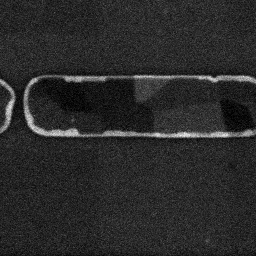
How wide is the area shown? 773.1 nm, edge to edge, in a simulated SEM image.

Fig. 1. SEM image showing one or a few lines or trenches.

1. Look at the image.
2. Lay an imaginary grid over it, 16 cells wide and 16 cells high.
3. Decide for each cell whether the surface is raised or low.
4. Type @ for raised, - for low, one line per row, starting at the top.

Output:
----------------
----------------
----------------
----------------
----------------
@-@@@@@@@@@@@@@@
@-@@@@@@@@@@@@@@
@-@@@@@@@@@@@@@@
---------@@@@@@-
----------------
----------------
----------------
----------------
----------------
----------------
----------------